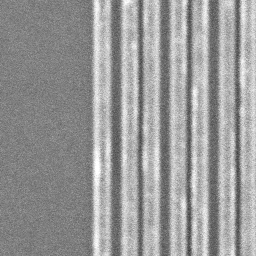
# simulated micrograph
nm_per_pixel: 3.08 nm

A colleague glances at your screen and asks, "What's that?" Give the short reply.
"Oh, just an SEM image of parallel lines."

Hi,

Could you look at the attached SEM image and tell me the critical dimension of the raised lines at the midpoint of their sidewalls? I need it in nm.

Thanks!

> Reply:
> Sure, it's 43.9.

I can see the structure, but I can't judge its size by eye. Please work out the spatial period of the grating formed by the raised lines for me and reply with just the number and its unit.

74.8 nanometres